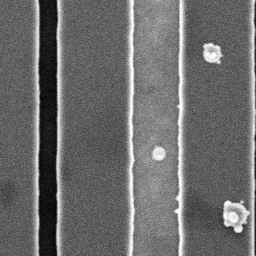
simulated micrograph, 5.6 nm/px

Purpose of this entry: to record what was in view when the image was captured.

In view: lines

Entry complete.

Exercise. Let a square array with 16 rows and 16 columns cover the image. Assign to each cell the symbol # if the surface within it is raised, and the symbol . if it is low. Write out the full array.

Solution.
##..####...#####
##..####...#####
##..####...#####
##..####...#####
##..####...#####
##..####...#####
##..####...#####
##..####...#####
##..####...#####
##..####...#####
##..####...#####
##..####...#####
##..####...#####
##..####...#####
##..####...#####
##..####...#####